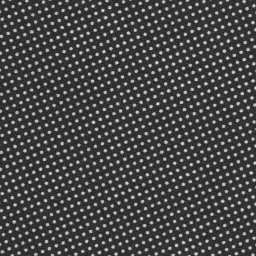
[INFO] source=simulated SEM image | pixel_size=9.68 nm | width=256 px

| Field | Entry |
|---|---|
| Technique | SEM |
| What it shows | a regular array of raised bodies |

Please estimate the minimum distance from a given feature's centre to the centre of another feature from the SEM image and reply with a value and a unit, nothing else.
70.7 nm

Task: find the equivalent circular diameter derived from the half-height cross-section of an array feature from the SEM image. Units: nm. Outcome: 32.8